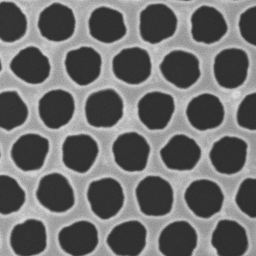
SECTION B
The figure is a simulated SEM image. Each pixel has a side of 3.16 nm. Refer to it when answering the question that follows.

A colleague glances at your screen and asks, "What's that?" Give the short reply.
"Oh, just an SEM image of a regular array of holes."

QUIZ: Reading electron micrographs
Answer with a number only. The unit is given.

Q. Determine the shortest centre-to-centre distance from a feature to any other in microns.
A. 0.152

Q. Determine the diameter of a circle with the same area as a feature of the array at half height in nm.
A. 120